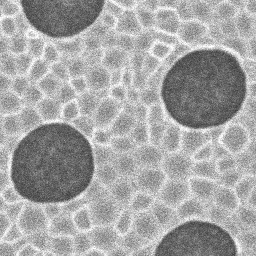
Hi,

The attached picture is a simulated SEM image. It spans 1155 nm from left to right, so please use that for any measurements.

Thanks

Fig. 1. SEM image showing holes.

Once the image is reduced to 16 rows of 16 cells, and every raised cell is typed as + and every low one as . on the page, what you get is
+.....++++++++++
++....++++++++++
++++++++++++++++
+++++++++++....+
++++++++++.....+
++++++++++.....+
++++++++++.....+
+++++++++++...++
++...+++++++++++
+.....++++++++++
+.....++++++++++
+.....++++++++++
++..++++++++++++
++++++++++++++++
+++++++++++...++
++++++++++.....+